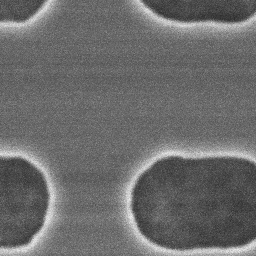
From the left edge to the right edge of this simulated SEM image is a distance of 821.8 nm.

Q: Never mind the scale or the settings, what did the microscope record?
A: holes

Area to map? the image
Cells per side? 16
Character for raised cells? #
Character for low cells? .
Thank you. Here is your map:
...######.......
################
################
################
################
################
################
################
################
################
..#######.......
...#####........
...#####........
...#####........
..#######.......
.#########.....#